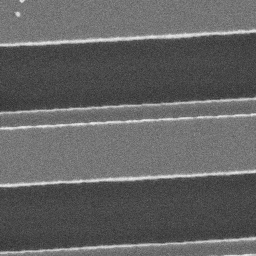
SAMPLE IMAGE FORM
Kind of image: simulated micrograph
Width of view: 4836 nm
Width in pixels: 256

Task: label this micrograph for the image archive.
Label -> lines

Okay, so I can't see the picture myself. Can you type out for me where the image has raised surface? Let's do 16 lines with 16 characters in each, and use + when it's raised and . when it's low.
++++++++++++++++
++++++++++++++++
++++++..........
................
................
................
...........+++++
++++++++++++++++
++++++++++++++++
++++++++++++++++
++++++++++++++++
++..............
................
................
................
.......+++++++++